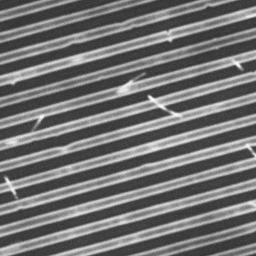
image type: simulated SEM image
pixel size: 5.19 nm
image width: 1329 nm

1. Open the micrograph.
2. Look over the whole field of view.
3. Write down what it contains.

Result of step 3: parallel lines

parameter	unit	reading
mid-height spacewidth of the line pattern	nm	65.1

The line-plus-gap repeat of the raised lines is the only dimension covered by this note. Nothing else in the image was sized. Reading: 108 nanometers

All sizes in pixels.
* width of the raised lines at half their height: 8.07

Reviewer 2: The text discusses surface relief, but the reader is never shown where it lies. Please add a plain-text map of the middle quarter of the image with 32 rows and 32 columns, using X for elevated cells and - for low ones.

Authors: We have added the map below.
X-------------XXXXXXX-----------
----------XXXXXXXX------------XX
-------XXXXXXX------------XXXXXX
---XXXXXXX-------------XXXXXXX--
XXXXXXX-----------XXXXXXXX------
XXX-----------XXXXXXXXX---------
------------XXXXXXXX-----------X
--------XXXXXXXX-----------XXXXX
----XXXXXXXXX-----------XXXXXXX-
XXXXXXXX------------XXXXXXXX----
XXXX-------------XXXXXXXX-------
X-------------XXXXXX------------
---------XXXXXXXX------------XXX
------XXXXXXXX-----------XXXXXXX
--XXXXXXX------------XXXXXXXX---
XXXXXX------------XXXXXXX-------
XX------------XXXXXXXX----------
----------XXXXXXXX------------XX
-------XXXXXXX------------XXXXXX
---XXXXXXXX------------XXXXXXX--
-XXXXXX------------XXXXXXXX-----
XXX------------XXXXXXXX---------
------------XXXXXXX------------X
--------XXXXXXXX------------XXXX
----XXXXXXXX------------XXXXXXXX
-XXXXXXX------------XXXXXXXX----
XXXXX------------XXXXXXX--------
X------------XXXXXXXX-----------
---------XXXXXXXX-------------XX
------XXXXXXX-------------XXXXXX
--XXXXXXXX-------------XXXXXX---
XXXXXX-------------XXXXXXX------